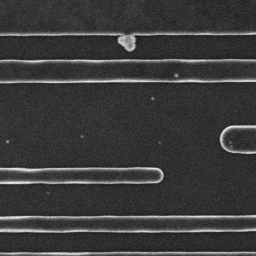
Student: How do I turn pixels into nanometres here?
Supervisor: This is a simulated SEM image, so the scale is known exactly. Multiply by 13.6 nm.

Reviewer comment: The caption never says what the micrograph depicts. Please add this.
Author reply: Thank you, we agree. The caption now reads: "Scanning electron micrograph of groups of lines, slits or small figures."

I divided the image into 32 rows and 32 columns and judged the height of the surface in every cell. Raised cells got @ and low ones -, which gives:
@@@@@@@@@@@@@@@@@@@@@@@@@@@@@@@@
@@@@@@@@@@@@@@@@@@@@@@@@@@@@@@@@
@@@@@@@@@@@@@@@@@@@@@@@@@@@@@@@@
@@@@@@@@@@@@@@@@@@@@@@@@@@@@@@@@
---------------@@---------------
---------------@@---------------
--------------------------------
---------------------@------@@--
@@@@@@@@@@@@@@@@@@@@@@@@@@@@@@@@
@@@@@@@@@@@@@@@@@@@@@@@@@@@@@@@@
--------------------------------
--------------------------------
--------------------------------
--------------------------------
--------------------------------
--------------------------------
----------------------------@@@@
----------------------------@@@@
----------------------------@@@@
--------------------------------
--------------------------------
@@@@@@@@@@@@@@@@@@@@------------
@@@@@@@@@@@@@@@@@@@@------------
--------------------------------
--------------------------------
--------------------------------
--------------------------------
@@@@@@@@@@@@@@@@@@@@@@@@@@@@@@@@
@@@@@@@@@@@@@@@@@@@@@@@@@@@@@@@@
--------------------------------
--------------------------------
--------------------------------